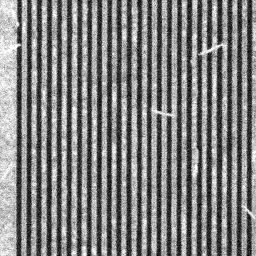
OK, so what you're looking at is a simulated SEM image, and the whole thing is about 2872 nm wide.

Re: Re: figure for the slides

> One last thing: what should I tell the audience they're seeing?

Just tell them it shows parallel lines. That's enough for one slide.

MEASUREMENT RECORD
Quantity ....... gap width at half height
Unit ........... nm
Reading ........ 61.7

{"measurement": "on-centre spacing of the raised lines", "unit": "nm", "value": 112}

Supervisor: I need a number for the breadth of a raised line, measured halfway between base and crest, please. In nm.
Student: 51.9